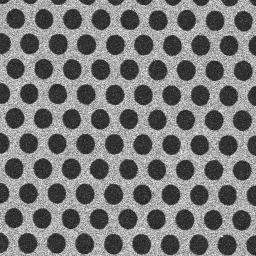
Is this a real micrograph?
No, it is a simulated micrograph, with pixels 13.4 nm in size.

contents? a regular array of holes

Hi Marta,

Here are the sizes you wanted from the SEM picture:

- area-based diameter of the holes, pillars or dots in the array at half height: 266 nm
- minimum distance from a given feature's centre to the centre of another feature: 379 nanometres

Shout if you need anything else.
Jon